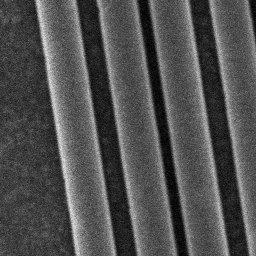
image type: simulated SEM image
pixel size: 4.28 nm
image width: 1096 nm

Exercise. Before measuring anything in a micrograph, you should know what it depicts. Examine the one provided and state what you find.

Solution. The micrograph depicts parallel lines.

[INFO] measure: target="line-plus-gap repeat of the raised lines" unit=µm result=0.239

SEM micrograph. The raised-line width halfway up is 0.166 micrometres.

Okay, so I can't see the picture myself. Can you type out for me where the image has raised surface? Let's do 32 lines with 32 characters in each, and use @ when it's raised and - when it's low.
-----@@@@@--@@@@@--@@@@@--@@@@@-
-----@@@@@--@@@@@--@@@@@--@@@@@-
-----@@@@@---@@@@--@@@@@---@@@@-
-----@@@@@---@@@@@-@@@@@---@@@@@
-----@@@@@---@@@@@-@@@@@---@@@@@
-----@@@@@---@@@@@--@@@@---@@@@@
------@@@@---@@@@@--@@@@@--@@@@@
------@@@@@--@@@@@--@@@@@--@@@@@
------@@@@@---@@@@--@@@@@---@@@@
------@@@@@---@@@@@-@@@@@---@@@@
------@@@@@---@@@@@-@@@@@---@@@@
------@@@@@---@@@@@-@@@@@---@@@@
-------@@@@---@@@@@--@@@@---@@@@
-------@@@@---@@@@@--@@@@@--@@@@
-------@@@@@--@@@@@--@@@@@---@@@
-------@@@@@---@@@@--@@@@@---@@@
-------@@@@@---@@@@@-@@@@@---@@@
-------@@@@@---@@@@@-@@@@@---@@@
--------@@@@---@@@@@--@@@@---@@@
--------@@@@---@@@@@--@@@@@--@@@
--------@@@@@--@@@@@--@@@@@--@@@
--------@@@@@---@@@@--@@@@@---@@
--------@@@@@---@@@@@-@@@@@---@@
--------@@@@@---@@@@@-@@@@@---@@
--------@@@@@---@@@@@--@@@@---@@
---------@@@@---@@@@@--@@@@@--@@
---------@@@@@--@@@@@--@@@@@--@@
---------@@@@@---@@@@--@@@@@---@
---------@@@@@---@@@@@-@@@@@---@
---------@@@@@---@@@@@-@@@@@---@
---------@@@@@---@@@@@-@@@@@---@
----------@@@@---@@@@@--@@@@---@